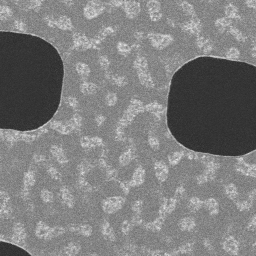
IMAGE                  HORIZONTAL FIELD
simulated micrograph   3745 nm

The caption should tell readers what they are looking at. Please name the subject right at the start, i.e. holes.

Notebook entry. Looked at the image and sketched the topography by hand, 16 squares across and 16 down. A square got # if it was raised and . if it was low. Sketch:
################
################
...#############
....############
....#######.....
....#######.....
....######......
...#######......
###########.....
############....
################
################
################
################
################
.###############